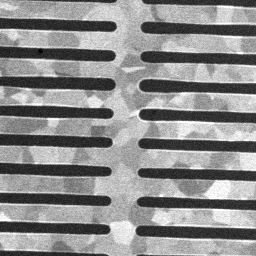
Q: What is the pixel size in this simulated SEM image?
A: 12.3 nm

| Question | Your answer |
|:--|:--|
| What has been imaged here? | groups of lines, slits or small figures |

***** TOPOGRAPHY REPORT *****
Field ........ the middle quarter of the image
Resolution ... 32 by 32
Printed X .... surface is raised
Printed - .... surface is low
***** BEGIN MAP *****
XXXXXXXXXXXXXXXXXXXXXXXXXXXXXXXX
XXXXXXXXXXXXXXXXXXXXXXXXXXXXXXXX
XXXXXXXXXXXXXXXXXXXXXXXXXXXXXXXX
------------XXXXXXXX---XXXXXXXXX
-------------XXXXXX-------------
-------------XXXXX--------------
------------XXXXXXX-------------
XXXXXXXXXXXXXXXXXXXXX----------X
XXXXXXXXXXXXXXXXXXXXXXXXXXXXXXXX
XXXXXXXXXXXXXXXXXXXXXXXXXXXXXXXX
--XXXXXXXXXXXXXXXXXXXXXXXXXXXXXX
------------XXXXXXX-------------
-------------XXXXX--------------
------------XXXXXXX-------------
XXXXXXXXXXXXXXXXXXXXXX----------
XXXXXXXXXXXXXXXXXXXXXXXXXXXXXXXX
XXXXXXXXXXXXXXXXXXXXXXXXXXXXXXXX
XXXXXXXXXXXXXXXXXXXXXXXXXXXXXXXX
------------XXXXXXX------------X
------------XXXXXXX-------------
------------XXXXXXX-------------
XXXXXXXXXXXXXXXXXXXX------------
XXXXXXXXXXXXXXXXXXXXXXXXXXXXXXXX
XXXXXXXXXXXXXXXXXXXXXXXXXXXXXXXX
XXXXXXXXXXXXXXXXXXXXXXXXXXXXXXXX
----------XXXXXXXXXXXXXXXXXXXXXX
------------XXXXXXX-------------
------------XXXXXX--------------
XXXXXXXXXXXXXXXXXXX-------------
XXXXXXXXXXXXXXXXXXXXXXXXXXXXXXXX
XXXXXXXXXXXXXXXXXXXXXXXXXXXXXXXX
XXXXXXXXXXXXXXXXXXXXXXXXXXXXXXXX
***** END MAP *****